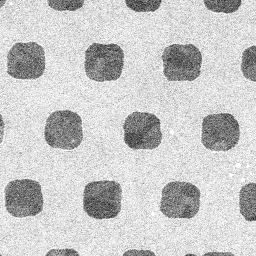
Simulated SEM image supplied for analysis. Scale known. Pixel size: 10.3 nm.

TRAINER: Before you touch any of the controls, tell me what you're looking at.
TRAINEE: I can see a regular array of raised bodies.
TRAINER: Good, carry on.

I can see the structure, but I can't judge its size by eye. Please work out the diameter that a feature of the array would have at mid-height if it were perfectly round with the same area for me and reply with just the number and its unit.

0.434 micrometres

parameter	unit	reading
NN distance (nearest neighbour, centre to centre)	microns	0.802